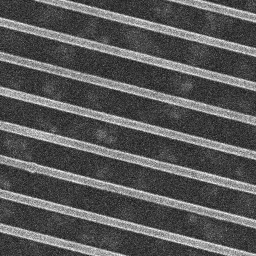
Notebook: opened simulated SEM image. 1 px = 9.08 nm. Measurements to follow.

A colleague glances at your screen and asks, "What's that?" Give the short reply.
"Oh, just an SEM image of parallel lines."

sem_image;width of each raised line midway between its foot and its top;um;0.0693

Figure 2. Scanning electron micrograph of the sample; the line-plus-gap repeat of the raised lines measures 302 nm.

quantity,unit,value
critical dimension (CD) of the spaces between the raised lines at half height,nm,234